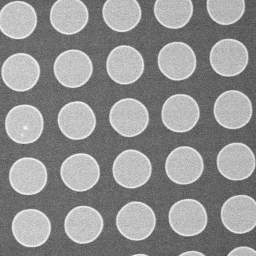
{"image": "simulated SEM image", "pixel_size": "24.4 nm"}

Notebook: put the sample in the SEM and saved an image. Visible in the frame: an array of small figures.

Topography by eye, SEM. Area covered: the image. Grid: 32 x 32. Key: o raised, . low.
.oo....ooo...oooo..ooooo..ooooo.
oooo..ooooo..ooooo.ooooo..oooo..
ooooo.ooooo..oooo...oooo...ooo..
oooo...ooo....ooo....o..........
.ooo............................
.....................oo....ooo..
........oo....ooo...oooo..ooooo.
.ooo...oooo..ooooo..oooo..ooooo.
ooooo..ooooo.ooooo..oooo...oooo.
ooooo..oooo...oooo...ooo....o...
.ooo....oo......................
............................oo..
...............oo....ooo...oooo.
..oo....ooo...oooo..ooooo..oooo.
.oooo..ooooo..ooooo.ooooo..oooo.
.oooo..ooooo..oooo...ooo....ooo.
.oooo...ooo....ooo..............
..oo............................
......................oo....ooo.
.........oo....ooo...oooo..ooooo
..ooo...oooo..ooooo..oooo..ooooo
.ooooo..oooo..ooooo..oooo...oooo
.ooooo..oooo..oooo...oooo....o..
..ooo....oo.....................
..............................o.
................oo....ooo...oooo
...oo....ooo...oooo..ooooo..oooo
..oooo..ooooo..oooo..ooooo..oooo
..oooo..ooooo..oooo...oooo..oooo
..oooo...ooo....ooo.............
...oo...........................
........................o....ooo